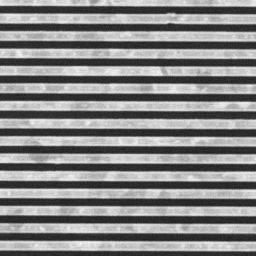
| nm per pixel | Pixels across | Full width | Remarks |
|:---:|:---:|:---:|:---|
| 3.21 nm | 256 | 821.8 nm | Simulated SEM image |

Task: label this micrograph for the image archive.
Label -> parallel lines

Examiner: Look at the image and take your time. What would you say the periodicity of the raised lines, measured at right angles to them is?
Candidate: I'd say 17.4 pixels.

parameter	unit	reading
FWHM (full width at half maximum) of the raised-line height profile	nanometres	27.7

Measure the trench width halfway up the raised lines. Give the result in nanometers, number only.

30.1